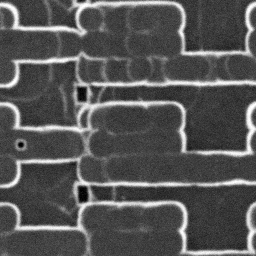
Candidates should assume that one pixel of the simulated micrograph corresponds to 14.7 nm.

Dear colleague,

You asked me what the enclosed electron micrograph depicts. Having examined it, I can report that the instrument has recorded wiring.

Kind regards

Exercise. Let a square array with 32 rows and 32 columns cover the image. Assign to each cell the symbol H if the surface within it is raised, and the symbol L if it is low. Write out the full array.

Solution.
LLLLLLLLLLLLHHHHHHHHHHLLLLLLLLLL
HHLLLLLLLLHHHHHHHHHHHHHLLLLLLLLH
HHLLLLLLLLHHHHHHHHHHHHHLLLLLLLLH
HHHLLLLLLLHHHHHHHHHHHHHLLLLLLLLH
HHHHHHHHHHHHHHHHHHHHHHHLLLLLLLLH
HHHHHHHHHHHHHHHHHHHHHHHLLLLLLLLH
HHHHHHHHHHHHHHHHHHHHHHHLLLLLLLLH
HHHHHHHHLHHHHHHHHHHHHHHHHHHHHHHH
HHLLLLLLLLHHHHHHHHHHHHHHHHHHHHHH
HHLLLLLLLLHHHHHHHHHHHHHHHHHHHHHH
HHLLLLLLLLLHLHHHHLHHHLLLLLLLLLLL
LLLLLLLLLLLLLLLLLLLLLLLLLLLLLLLL
LLLLLLLLLLLLLLLLLLLLLLLLLLLLLLLL
HHLLLLLLLLLLHHHHHHHHHHHLLLLLLLLH
HHLLLLLLLLLHHHHHHHHHHHHLLLLLLLLH
HHLLLLLLLLLHHHHHHHHHHHHLLLLLLLLH
HHHHHHHHHHHHHHHHHHHHHHHLLLLLLLLH
HHHHHHHHHHHHHHHHHHHHHHHLLLLLLLLH
HHHHHHHHHHHHHHHHHHHHHHHLLLLLLLLH
HHHHHHHHHHHHHHHHHHHHHHHHHHHHHHHH
HHHLLLLLLLHHHHHHHHHHHHHHHHHHHHHH
HHLLLLLLLLHHHHHHHHHHHHHHHHHHHHHH
HHLLLLLLLLHHHHHHHHHHHHHHHHHHHHHH
LLLLLLLLLLLLLLLLLLLLLLLLLLLLLLLL
LLLLLLLLLLLLLLLLLLLLLLLLLLLLLLLL
HLLLLLLLLLLHHHHHHHHHHHLLLLLLLLLL
HHLLLLLLLLHHHHHHHHHHHHHLLLLLLLLH
HHLLLLLLLLHHHHHHHHHHHHHLLLLLLLLH
HHHLLLLLLHHHHHHHHHHHHHHLLLLLLLLH
HHHHHHHHHHHHHHHHHHHHHHHLLLLLLLLH
HHHHHHHHHHHHHHHHHHHHHHHLLLLLLLLH
HHHHHHHHHHHHHHHHHHHHHHHHLLLLHHHH